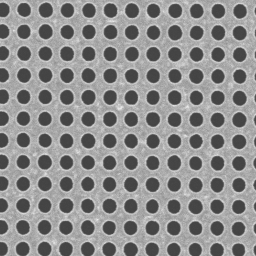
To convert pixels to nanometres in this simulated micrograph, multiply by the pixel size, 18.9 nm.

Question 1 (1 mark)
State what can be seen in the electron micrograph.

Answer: a regular array of holes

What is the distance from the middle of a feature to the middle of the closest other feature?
404 nanometres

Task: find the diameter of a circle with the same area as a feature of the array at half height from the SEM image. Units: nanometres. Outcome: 272